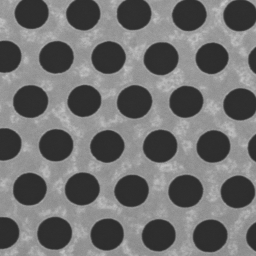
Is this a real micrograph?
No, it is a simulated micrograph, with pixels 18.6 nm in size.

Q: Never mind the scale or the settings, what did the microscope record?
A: a regular array of holes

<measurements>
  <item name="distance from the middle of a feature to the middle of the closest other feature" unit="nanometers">941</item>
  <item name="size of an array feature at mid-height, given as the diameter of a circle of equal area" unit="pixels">33.3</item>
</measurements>